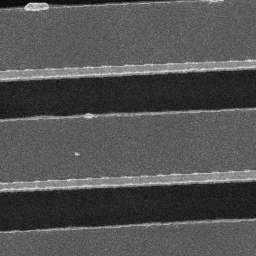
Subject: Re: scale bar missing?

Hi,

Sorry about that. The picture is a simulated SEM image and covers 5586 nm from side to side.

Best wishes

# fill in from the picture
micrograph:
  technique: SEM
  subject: lines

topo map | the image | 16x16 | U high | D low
DUUUUUUUUUUUUUUU
UUUUUUUUUUUUUUUU
UUUUUUUUUUUUUUUU
UUUUUUUUUUUUUUUU
UUUUUUUUUUDDDDDD
DDDDDDDDDDDDDDDD
DDDDDDDDDDDDDDDD
UUUUUUUUUUUUUUUU
UUUUUUUUUUUUUUUU
UUUUUUUUUUUUUUUU
UUUUUUUUUUUUUUUU
UUUUUUUUUUDDDDDD
DDDDDDDDDDDDDDDD
DDDDDDDDDDDDDDDD
DUUUUUUUUUUUUUUU
UUUUUUUUUUUUUUUU